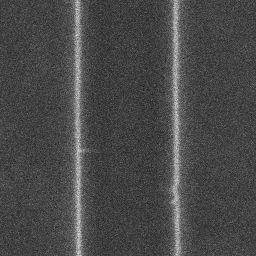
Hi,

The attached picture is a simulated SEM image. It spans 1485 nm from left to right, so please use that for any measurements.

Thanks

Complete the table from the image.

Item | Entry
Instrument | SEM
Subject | one or a few lines or trenches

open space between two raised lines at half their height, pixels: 97.2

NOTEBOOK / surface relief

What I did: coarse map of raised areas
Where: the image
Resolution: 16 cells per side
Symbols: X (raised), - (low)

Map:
XXXXX------XXXXX
XXXXX------XXXXX
XXXXX------XXXXX
XXXXX------XXXXX
XXXXX------XXXXX
XXXXX------XXXXX
XXXXX------XXXXX
XXXXX------XXXXX
XXXXX------XXXXX
XXXXX------XXXXX
XXXXX------XXXXX
XXXXX------XXXXX
XXXXX------XXXXX
XXXXX------XXXXX
XXXXX------XXXXX
XXXXX------XXXXX